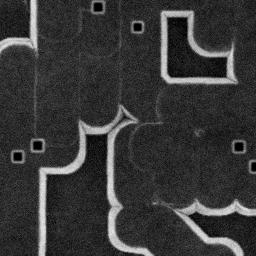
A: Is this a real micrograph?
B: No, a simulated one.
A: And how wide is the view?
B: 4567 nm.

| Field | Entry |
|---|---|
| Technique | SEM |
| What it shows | wiring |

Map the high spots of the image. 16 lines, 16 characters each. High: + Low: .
..++++++++++++++
..++++++++..++++
..++++++++..++++
++++++++++....++
++++++++++....++
++++++++++++++++
++++++++++++++++
++++++++++++++++
+++++..+++++++++
+++++..+++++++++
++++...+++++++++
+++....+++++++++
+++....+++++++++
+++....+++++....
+++....+++++....
+++.....+++++++.